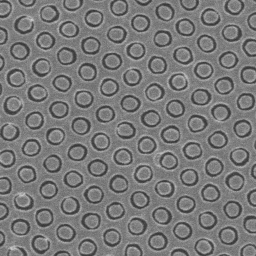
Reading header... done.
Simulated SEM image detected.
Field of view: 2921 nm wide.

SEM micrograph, a regular array of ring-shaped grooves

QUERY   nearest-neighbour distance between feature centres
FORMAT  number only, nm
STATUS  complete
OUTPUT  287